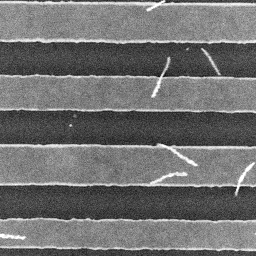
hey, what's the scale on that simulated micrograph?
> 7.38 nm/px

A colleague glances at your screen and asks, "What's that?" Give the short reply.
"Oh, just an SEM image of lines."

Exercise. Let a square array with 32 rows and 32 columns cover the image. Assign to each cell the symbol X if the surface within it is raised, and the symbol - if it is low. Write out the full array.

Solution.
XXXXXXXXXXXXXXXXXXXXXXXXXXXXXXX-
XXXXXXXXXXXXXXXXXXXXXXXXXXXXXXXX
XXXXXXXXXXXXXXXXXXXXXXXXXXXXXXXX
XXXXXXXXXXXXXXXXXXXXXXXXXXXXXXXX
XXXXXXXXXXXXXXXXXXXXXXXXXXXXXXXX
--------------------------------
--------------------------------
--------------------------------
--------------------------------
XXXXXXX-X--X--------------------
XXXXXXXXXXXXXXXXXXXXXXXXXXXXXXXX
XXXXXXXXXXXXXXXXXXXXXXXXXXXXXXXX
XXXXXXXXXXXXXXXXXXXXXXXXXXXXXXXX
XXXXXXXXXXXXXXXXXXXXXXXXXXXXXXXX
--------------------------------
--------------------------------
--------------------------------
--------------------------------
XXXXXXXXXXXXXXXXXXXXXXXXXXXXXXXX
XXXXXXXXXXXXXXXXXXXXXXXXXXXXXXXX
XXXXXXXXXXXXXXXXXXXXXXXXXXXXXXXX
XXXXXXXXXXXXXXXXXXXXXXXXXXXXXXXX
XXXXXXXXXXXXXXXXXXXXXXXXXXXXXXXX
--------------------------------
--------------------------------
--------------------------------
--------------------------------
XXXXXXXXXXXXXXXXX-XXXXX---------
XXXXXXXXXXXXXXXXXXXXXXXXXXXXXXXX
XXXXXXXXXXXXXXXXXXXXXXXXXXXXXXXX
XXXXXXXXXXXXXXXXXXXXXXXXXXXXXXXX
--------------------------------